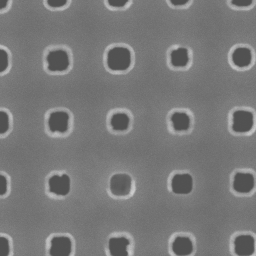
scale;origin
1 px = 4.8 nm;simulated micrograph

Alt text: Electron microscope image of a regular array of holes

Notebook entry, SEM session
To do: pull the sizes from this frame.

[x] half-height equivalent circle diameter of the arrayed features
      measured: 100 nm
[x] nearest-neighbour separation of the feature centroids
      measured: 0.292 µm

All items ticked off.